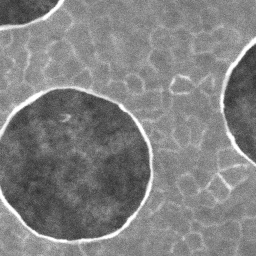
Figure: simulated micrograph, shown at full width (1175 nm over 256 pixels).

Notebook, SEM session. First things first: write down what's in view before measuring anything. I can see holes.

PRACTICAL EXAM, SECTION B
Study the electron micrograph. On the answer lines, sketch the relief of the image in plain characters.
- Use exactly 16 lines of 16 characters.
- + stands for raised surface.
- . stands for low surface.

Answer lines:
...+++++++++++++
..++++++++++++++
++++++++++++++++
+++++++++++++++.
++++++++++++++..
++++++++++++++..
++.....+++++++..
+.......++++++..
.........+++++..
.........++++++.
.........+++++++
.........+++++++
.........+++++++
+.......++++++++
++.....+++++++++
++++++++++++++++